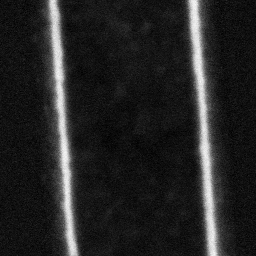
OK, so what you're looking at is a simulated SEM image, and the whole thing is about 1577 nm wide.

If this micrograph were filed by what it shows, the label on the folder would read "one or a few lines or trenches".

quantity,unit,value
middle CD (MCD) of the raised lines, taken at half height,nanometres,873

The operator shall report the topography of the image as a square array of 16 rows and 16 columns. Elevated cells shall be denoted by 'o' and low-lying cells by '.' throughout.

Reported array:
...ooooooooo....
...ooooooooo....
...ooooooooo....
....oooooooo....
....oooooooo....
....ooooooooo...
....ooooooooo...
....ooooooooo...
....ooooooooo...
....ooooooooo...
....ooooooooo...
....ooooooooo...
....ooooooooo...
....ooooooooo...
....ooooooooo...
....ooooooooo...